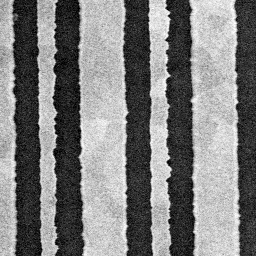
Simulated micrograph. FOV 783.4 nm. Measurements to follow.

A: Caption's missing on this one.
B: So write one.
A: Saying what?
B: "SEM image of lines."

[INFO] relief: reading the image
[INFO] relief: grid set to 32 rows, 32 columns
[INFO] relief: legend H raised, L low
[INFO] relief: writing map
HHLLLHHLLLHHHHHHLLLHHLLLHHHHHLLL
HHLLLHHLLLHHHHHHLLLHHLLLHHHHHLLL
HHLLLHHLLLHHHHHHLLLHHLLLHHHHHHLL
HHLLLHHLLLHHHHHHLLLHHLLLHHHHHHLL
HHLLLHHLLLHHHHHLLLLHHLLLHHHHHHLL
HHLLLHHLLLHHHHHLLLLHHLLLHHHHHHLL
HHLLLHHLLLHHHHHLLLLHHLLLHHHHHLLL
HHLLLHHLLLHHHHHLLLLHHLLLHHHHHLLL
HHLLLHHLLLHHHHHHLLLHHLLLHHHHHLLL
HHLLLHHLLLHHHHHHLLLHHLLLHHHHHHLL
HHLLLHHLLLHHHHHHLLLHHLLLHHHHHHLL
HHLLLHHLLLHHHHHHLLLHHLLLHHHHHHLL
HHLLLHHLLLHHHHHHLLLHHLLLHHHHHHLL
HHLLLHHLLLHHHHHHLLLHHLLLHHHHHHLL
HHLLLHHLLLHHHHHHLLLHHLLLHHHHHHLL
HHLLLHHLLLHHHHHHLLLHHLLLHHHHHHLL
HHLLLHHLLLHHHHHHLLLHHLLLHHHHHHLL
HHLLLHHLLLHHHHHHLLLHHLLLHHHHHHLL
HHLLLHHLLLHHHHHHLLLHHLLLHHHHHHLL
HHLLLHHLLLHHHHHHLLLHHLLLHHHHHHLL
HHLLLHHLLLHHHHHHLLLHHLLLHHHHHHLL
HHLLLHHLLLHHHHHHLLLHHLLLHHHHHHLL
HHLLLHHLLLHHHHHHLLLHHLLLHHHHHHLL
HHLLLHHLLLHHHHHHLLLHHLLLHHHHHHLL
HHLLLHHLLLHHHHHHLLLHHLLLHHHHHHLL
HHLLLHHLLLHHHHHHLLLHHLLLHHHHHHLL
HHLLLHHLLLHHHHHHLLLHHLLLHHHHHHLL
HHLLLHHLLLHHHHHHLLLHHLLLHHHHHHLL
HHLLLHHLLLHHHHHHLLLHHLLLHHHHHHLL
HHLLLHHLLLHHHHHHLLLHHLLLHHHHHHLL
HHLLLHHLLLLHHHHHLLLHHLLLHHHHHHLL
HHLLLHHLLLHHHHHHLLLHHLLLHHHHHHLL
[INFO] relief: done